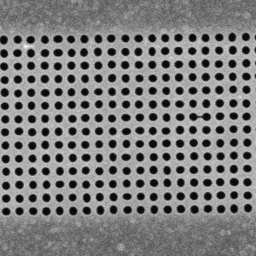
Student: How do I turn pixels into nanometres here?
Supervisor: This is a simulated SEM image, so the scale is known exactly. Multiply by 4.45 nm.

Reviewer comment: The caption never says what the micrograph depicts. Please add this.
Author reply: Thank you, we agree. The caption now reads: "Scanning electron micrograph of a regular array of holes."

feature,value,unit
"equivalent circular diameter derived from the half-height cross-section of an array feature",35.9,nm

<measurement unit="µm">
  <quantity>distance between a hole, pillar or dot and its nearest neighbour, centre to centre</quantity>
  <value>0.0573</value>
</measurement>